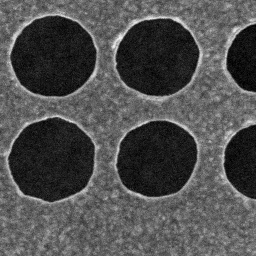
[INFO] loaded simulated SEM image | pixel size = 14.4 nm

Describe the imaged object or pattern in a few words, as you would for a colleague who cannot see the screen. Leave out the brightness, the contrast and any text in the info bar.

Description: holes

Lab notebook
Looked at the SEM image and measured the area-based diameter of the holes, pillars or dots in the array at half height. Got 1190 nm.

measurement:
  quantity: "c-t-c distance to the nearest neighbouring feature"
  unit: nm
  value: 1480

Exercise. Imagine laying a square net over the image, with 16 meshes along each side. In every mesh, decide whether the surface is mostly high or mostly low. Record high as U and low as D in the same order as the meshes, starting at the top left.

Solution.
UUUUUUUUUUUUUUUU
UUDDDUUUUDDUUUUU
UDDDDDUUDDDDUUUD
UDDDDDUDDDDDUUDD
UDDDDDUDDDDDUUDD
UUDDDUUUDDDUUUUD
UUUUUUUUUUUUUUUU
UUUDUUUUUUUUUUUU
UDDDDDUUDDDDUUUD
UDDDDDUDDDDDUUDD
UDDDDDUDDDDDUUDD
UDDDDUUUDDDDUUDD
UUUDUUUUUUUUUUUU
UUUUUUUUUUUUUUUU
UUUUUUUUUUUUUUUU
UUUUUUUUUUUUUUUU